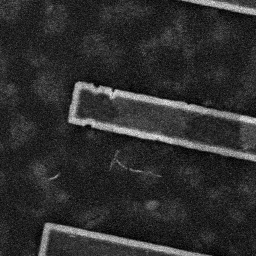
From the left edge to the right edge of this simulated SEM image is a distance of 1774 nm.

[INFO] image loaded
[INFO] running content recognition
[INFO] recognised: one or a few lines or trenches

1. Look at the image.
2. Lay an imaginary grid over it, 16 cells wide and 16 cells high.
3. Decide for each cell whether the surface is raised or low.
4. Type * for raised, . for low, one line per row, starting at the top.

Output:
...............*
................
................
................
................
.....*..........
.....******.....
.....***********
.........*******
..............**
................
................
................
................
...**...........
...*******......